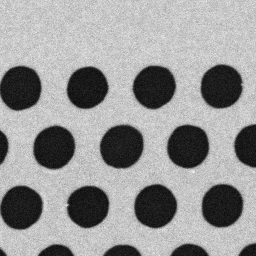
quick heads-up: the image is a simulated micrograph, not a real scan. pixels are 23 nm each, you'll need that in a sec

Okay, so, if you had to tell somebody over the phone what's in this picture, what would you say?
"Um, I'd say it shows a regular array of holes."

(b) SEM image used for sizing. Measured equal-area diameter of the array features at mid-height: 981 nm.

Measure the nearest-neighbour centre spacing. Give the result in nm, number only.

1540